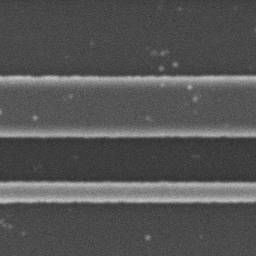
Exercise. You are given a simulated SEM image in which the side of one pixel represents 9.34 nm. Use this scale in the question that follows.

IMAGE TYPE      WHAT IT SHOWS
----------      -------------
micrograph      lines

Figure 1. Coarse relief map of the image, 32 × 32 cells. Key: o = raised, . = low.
................................
................................
................................
................................
................................
................................
................................
................................
................................
................................
oooooooooooooooooooooooooooooooo
oooooooooooooooooooooooooooooooo
oooooooooooooooooooooooooooooooo
oooooooooooooooooooooooooooooooo
oooooooooooooooooooooooooooooooo
oooooooooooooooooooooooooooooooo
oooooooooooooooooooooooooooooooo
................................
................................
................................
................................
................................
................................
oooooooooooooooooooooooooooooooo
oooooooooooooooooooooooooooooooo
................................
................................
................................
................................
................................
................................
................................